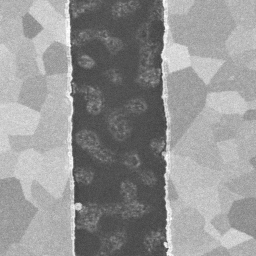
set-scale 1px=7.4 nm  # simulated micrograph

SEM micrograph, one or a few lines or trenches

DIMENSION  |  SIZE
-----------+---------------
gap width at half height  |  695 nanometers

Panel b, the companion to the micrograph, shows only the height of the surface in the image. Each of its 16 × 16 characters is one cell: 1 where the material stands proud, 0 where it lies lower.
1111000000111111
1111000000111111
1111000000111111
1111000000111111
1111000000111111
1111000000111111
1111100000111111
1111000000111111
1111000000111111
1111000000111111
1111000000111111
1111100000111111
1111100000111111
1111100000011111
1111100000111111
1111100000011111